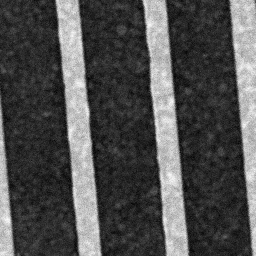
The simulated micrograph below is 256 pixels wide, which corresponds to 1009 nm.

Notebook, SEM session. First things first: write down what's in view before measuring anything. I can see one or a few lines or trenches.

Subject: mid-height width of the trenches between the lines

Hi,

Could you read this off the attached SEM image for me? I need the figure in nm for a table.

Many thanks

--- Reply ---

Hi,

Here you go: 258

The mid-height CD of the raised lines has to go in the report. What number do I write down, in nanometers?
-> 80.9